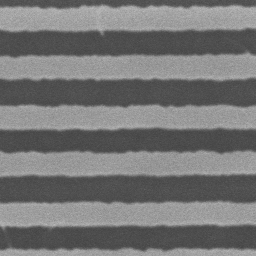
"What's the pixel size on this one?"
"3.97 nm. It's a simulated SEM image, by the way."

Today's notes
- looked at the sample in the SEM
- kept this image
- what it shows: lines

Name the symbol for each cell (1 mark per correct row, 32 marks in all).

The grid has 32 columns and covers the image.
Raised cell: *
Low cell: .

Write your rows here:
................................
********************************
********************************
********************************
................................
................................
................................
********************************
********************************
********************************
................................
................................
................................
********************************
********************************
********************************
................................
................................
................................
********************************
********************************
********************************
................................
................................
................................
*************.**.***************
********************************
********************************
................................
................................
................................
********************************